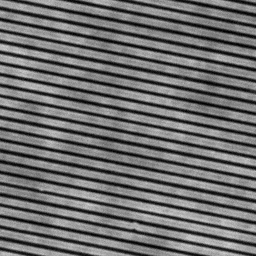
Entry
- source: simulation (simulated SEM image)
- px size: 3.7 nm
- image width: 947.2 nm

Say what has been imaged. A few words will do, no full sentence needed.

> parallel lines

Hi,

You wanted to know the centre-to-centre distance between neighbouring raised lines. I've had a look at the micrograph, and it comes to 39.7 nanometers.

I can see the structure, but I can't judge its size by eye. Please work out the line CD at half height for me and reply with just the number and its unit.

22.3 nanometers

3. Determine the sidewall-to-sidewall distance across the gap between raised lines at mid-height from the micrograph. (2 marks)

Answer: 14.9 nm